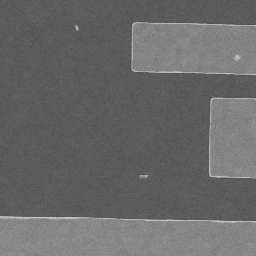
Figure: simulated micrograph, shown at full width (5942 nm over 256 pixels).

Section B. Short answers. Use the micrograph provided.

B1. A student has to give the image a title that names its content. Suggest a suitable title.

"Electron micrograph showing groups of lines, slits or small figures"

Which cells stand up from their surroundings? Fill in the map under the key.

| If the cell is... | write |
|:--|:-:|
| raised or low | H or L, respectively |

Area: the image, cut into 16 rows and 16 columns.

LLLLLLLLLLLLLLLL
LLLLLLLLLHHHLLLL
LLLLLLLLHHHHHHHH
LLLLLLLLHHHHHHHH
LLLLLLLLLLLHHHHH
LLLLLLLLLLLLLLLL
LLLLLLLLLLLLLHHH
LLLLLLLLLLLLLHHH
LLLLLLLLLLLLLHHH
LLLLLLLLLLLLLHHH
LLLLLLLLLLLLLHHH
LLLLLLLLLLLLLLLL
LLLLLLLLLLLLLLLL
LLLLLLLLLLLLLLLL
HHHHHHHHHHHHHHHH
HHHHHHHHHHHHHHHH